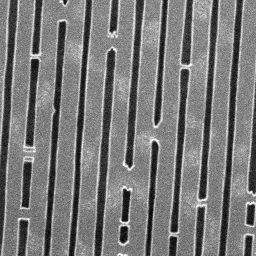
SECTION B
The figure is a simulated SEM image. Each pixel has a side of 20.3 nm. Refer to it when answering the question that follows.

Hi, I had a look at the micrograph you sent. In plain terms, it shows parallel lines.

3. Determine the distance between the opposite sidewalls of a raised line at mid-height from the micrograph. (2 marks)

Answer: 349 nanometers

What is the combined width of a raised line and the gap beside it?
507 nm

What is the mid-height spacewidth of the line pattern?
147 nanometres